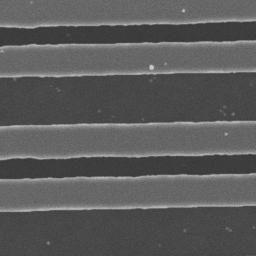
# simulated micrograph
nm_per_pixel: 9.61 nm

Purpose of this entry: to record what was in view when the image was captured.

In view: lines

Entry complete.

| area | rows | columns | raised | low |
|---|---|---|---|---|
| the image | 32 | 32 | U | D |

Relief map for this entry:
UUUUUUUUUUUUUUUUUUUUUUUUUUUUUUUU
UUUUUUUUUUUUUUUUUUUUUUUUUUUUUUUU
UUUUUUUUUUUUUUUUUUUUUUUUUUUUUUUU
DDUUDDDDDDDDDDDDDDDDDDDDDDDDDDDD
DDDDDDDDDDDDDDDDDDDDDDDDDDDDDDDD
DDDDDDDDDUDDDDUUUUUUUUUUUUUUUUUU
UUUUUUUUUUUUUUUUUUUUUUUUUUUUUUUU
UUUUUUUUUUUUUUUUUUUUUUUUUUUUUUUU
UUUUUUUUUUUUUUUUUUUUUUUUUUUUUUUU
UUUDDUUUDDDDDDDDDDDDDDDDDDDDDDDD
DDDDDDDDDDDDDDDDDDDDDDDDDDDDDDDD
DDDDDDDDDDDDDDDDDDDDDDDDDDDDDDDD
DDDDDDDDDDDDDDDDDDDDDDDDDDDDDDDD
DDDDDDDDDDDDDDDDDDDDDDDDDDDDDDDD
DDDDDDDDDDDDDDDDDDDDDDDDDDDDDDDD
DDDDDDDDDDDDDDDDDDUUUUUUUUUUUUUU
UUUUUUUUUUUUUUUUUUUUUUUUUUUUUUUU
UUUUUUUUUUUUUUUUUUUUUUUUUUUUUUUU
UUUUUUUUUUUUUUUUUUUUUUUUUUUUUUUU
UUUUUUUUUUUUUUUUUUUUDDDDDDDDDDDD
DDDDDDDDDDDDDDDDDDDDDDDDDDDDDDDD
DDDDDDDDDDDDDDDDDDDDDDDDDDDDDDDD
UUUUUUUUUUUUUUUUUUUUUUUUUUUUUUUU
UUUUUUUUUUUUUUUUUUUUUUUUUUUUUUUU
UUUUUUUUUUUUUUUUUUUUUUUUUUUUUUUU
UUUUUUUUUUUUUUUUUUUUUUUUUUUUUUUU
DDDDDDDDDDDDDDDDDDDDDDDDDDDDDDDD
DDDDDDDDDDDDDDDDDDDDDDDDDDDDDDDD
DDDDDDDDDDDDDDDDDDDDDDDDDDDDDDDD
DDDDDDDDDDDDDDDDDDDDDDDDDDDDDDDD
DDDDDDDDDDDDDDDDDDDDDDDDDDDDDDDD
DDDDDDDDDDDDDDDDDDDDDDDDDDDDDDDD